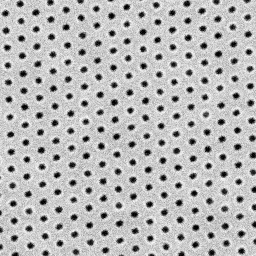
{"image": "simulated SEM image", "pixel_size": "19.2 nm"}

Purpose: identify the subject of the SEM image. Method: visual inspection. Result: a regular array of holes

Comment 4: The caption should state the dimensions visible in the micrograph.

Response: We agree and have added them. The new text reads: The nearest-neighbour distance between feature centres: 323 nm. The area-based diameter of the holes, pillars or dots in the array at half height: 0.155 microns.